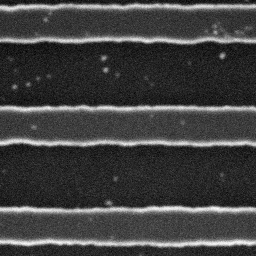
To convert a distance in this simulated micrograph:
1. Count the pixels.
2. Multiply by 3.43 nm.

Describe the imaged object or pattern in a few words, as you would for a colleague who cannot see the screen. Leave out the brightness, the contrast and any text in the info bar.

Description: lines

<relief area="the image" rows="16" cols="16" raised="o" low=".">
oooooooooooooooo
oooooooooooooooo
oooooooooooooooo
................
................
................
................
oooooooooooooooo
oooooooooooooooo
................
................
................
................
oooooooooooooooo
oooooooooooooooo
................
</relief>